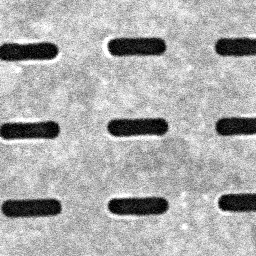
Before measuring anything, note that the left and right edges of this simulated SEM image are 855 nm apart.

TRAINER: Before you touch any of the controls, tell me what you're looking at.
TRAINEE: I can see holes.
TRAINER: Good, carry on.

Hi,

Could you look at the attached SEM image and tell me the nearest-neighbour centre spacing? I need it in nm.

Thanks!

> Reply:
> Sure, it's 266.